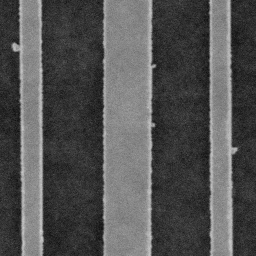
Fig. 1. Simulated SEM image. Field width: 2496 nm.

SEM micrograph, lines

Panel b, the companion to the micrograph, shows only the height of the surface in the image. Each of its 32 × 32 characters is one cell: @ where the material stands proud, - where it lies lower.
---@@--------@@@@@@-------@@@---
---@@--------@@@@@@-------@@@---
---@@--------@@@@@@-------@@@---
---@@--------@@@@@@-------@@@---
---@@--------@@@@@@-------@@@---
---@@--------@@@@@@-------@@@---
---@@--------@@@@@@-------@@@---
---@@--------@@@@@@-------@@@---
---@@--------@@@@@@-------@@@---
---@@--------@@@@@@-------@@@---
---@@--------@@@@@@-------@@@---
---@@--------@@@@@@-------@@@---
---@@--------@@@@@@-------@@@---
---@@--------@@@@@@-------@@@---
---@@--------@@@@@@-------@@@---
---@@--------@@@@@@-------@@@---
---@@--------@@@@@@-------@@@---
---@@--------@@@@@@-------@@@---
---@@--------@@@@@@-------@@@---
---@@--------@@@@@@-------@@@---
---@@--------@@@@@@-------@@@---
---@@--------@@@@@@-------@@@---
---@@--------@@@@@@-------@@@---
---@@--------@@@@@@-------@@@---
---@@--------@@@@@@-------@@@---
---@@--------@@@@@@-------@@@---
---@@--------@@@@@@-------@@@---
---@@--------@@@@@@-------@@@---
---@@--------@@@@@@-------@@@---
---@@--------@@@@@@-------@@@---
---@@--------@@@@@@-------@@@---
---@@--------@@@@@@-------@@@---